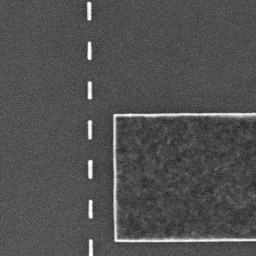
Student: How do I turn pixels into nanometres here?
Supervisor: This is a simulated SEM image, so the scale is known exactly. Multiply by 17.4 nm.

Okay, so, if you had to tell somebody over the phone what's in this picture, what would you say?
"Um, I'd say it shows wiring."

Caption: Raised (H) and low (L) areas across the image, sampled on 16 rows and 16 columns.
LLLLLLLLLLLLLLLL
LLLLLLLLLLLLLLLL
LLLLLLLLLLLLLLLL
LLLLLLLLLLLLLLLL
LLLLLLLLLLLLLLLL
LLLLLLLLLLLLLLLL
LLLLLLLLLLLLLLLL
LLLLLLLHHHHHHHHH
LLLLLLLHHHHHHHHH
LLLLLLLHHHHHHHHH
LLLLLLLHHHHHHHHH
LLLLLLLHHHHHHHHH
LLLLLLLHHHHHHHHH
LLLLLLLHHHHHHHHH
LLLLLLLHHHHHHHHH
LLLLLLLLLLLLLLLL